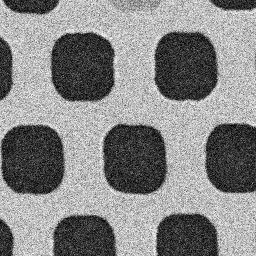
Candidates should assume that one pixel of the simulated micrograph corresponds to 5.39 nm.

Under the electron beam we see holes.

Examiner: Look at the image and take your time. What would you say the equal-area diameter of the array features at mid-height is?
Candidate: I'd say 377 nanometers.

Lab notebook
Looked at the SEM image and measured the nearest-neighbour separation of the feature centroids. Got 552 nm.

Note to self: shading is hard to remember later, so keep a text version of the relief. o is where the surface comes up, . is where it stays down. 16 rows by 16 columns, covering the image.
o..ooooooooooo..
oooooooooooooooo
oooo...ooo...ooo
.oo....ooo...ooo
.oo....ooo....oo
.oo....ooo...ooo
oooooooooooooooo
oooooooooooooooo
....ooo...ooo...
....oo....ooo...
....ooo...ooo...
....ooo...ooo...
oooooooooooooooo
oooo..ooooo..ooo
.oo....ooo....oo
.oo....ooo....oo